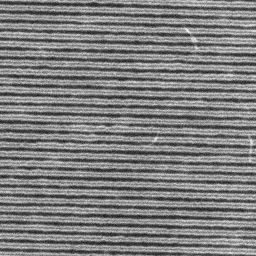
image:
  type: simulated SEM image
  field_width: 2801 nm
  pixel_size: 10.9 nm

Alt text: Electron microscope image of parallel lines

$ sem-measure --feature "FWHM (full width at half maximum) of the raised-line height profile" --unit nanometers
68.3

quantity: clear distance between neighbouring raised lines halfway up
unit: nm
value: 31.4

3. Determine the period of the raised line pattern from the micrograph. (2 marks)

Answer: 0.0999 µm